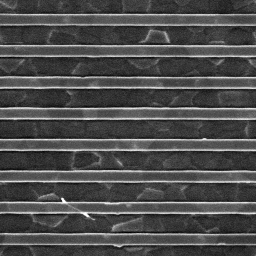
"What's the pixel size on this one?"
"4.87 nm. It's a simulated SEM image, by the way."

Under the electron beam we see parallel lines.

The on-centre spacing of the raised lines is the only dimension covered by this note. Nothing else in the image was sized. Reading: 31.4 pixels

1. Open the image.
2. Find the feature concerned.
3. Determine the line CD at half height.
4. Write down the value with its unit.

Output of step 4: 53.5 nanometers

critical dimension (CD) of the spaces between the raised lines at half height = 20.1 px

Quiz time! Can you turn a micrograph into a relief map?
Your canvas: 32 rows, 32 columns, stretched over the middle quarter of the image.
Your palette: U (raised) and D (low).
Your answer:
DDDDDDDDDDDDDDDDDDDDDDDDDDDDDDDD
DDDDDDDDDDDDDDDDDDDDDDDDDDDDDDDD
DDDDDDDDDDDDDDDDDDDDDDDDDDDDDDDD
UUUUUUUUUUUUUUUUUUUUUUUUUUUUUUUU
UUUUUUUUUUUUUUUUUUUUUUUUUUUUUUUU
UUUUUUUUUUUUUUUUUUUUUUUUUUUUUUUU
DDDDDDDDDDDDDDDDDDDDDDDDDDDDDDDD
DDDDDDDDDDDDDDDDDDDDDDDDDDDDDDDD
DDDDDDDDDDDDDDDDDDDDDDDDDDDDDDDD
DDDDDDDDDDDDDDDDDDDDDDDDDDDDDDDD
DDDDDDDDDDDDDDDDDDDDDDDDDDDDDDDD
UUUUUUUUUUUUUUUUUUUUUUUUUUUUUUUU
UUUUUUUUUUUUUUUUUUUUUUUUUUUUUUUU
UUUUUUUUUUUUUUUUUUUUUUUUUUUUUUUU
DDDDDDDDDDDDDDDDDDDDDDDDDDDDDDDD
DDDDDDDDDDDDDDDDDDDDDDDDDDDDDDDD
DDDDDDDDDDDDDDDDDDDDDDDDDDDDDDDD
DDDDDDDDDDDDDDDDDDDDDDDDDDDDDDDD
DDDDDDDDDDDDDDDDDDDDDDDDDDDDDDDD
UUUUUUUUUUUUUUUUUUUUUUUUUUUUUUUU
UUUUUUUUUUUUUUUUUUUUUUUUUUUUUUUU
UUUUUUUUUUUUUUUUUUUUUUUUUUUUUUUU
DDDDDDDDDDDDDDDDDDDDDDDDDDDDDDDD
DDDDDDDDDDDDDDDDDDDDDDDDDDDDDDDD
DDDDDDDDDDDDDDDDDDDDDDDDDDDDDDDD
DDDDDDDDDDDDDDDDDDDDDDDDDDDDDDDD
DDDDDDDDDDDDDDDDDDDDDDDDDDDDDDDD
UUUUUUUUUUUUUUUUUUUUUUUUUUUUUUUU
UUUUUUUUUUUUUUUUUUUUUUUUUUUUUUUU
DDDDDDDDDDDDDDUUUUUDDDDDDDDDDDDD
DDDDDDDDDDDDDDDDDDDDDDDDDDDDDDDD
DDDDDDDDDDDDDDDDDDDDDDDDDDDDDDDD